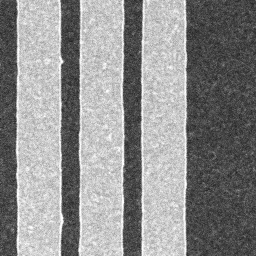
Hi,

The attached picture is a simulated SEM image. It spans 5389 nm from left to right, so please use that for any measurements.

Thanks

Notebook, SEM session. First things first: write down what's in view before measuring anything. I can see parallel lines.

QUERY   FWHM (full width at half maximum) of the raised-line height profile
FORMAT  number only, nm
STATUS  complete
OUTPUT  908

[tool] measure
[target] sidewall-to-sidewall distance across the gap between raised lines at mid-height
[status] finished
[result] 0.418 microns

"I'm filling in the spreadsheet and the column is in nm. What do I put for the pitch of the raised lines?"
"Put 1310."